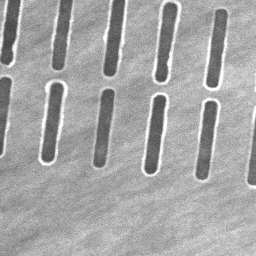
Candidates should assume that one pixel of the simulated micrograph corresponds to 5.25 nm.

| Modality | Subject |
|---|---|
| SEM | holes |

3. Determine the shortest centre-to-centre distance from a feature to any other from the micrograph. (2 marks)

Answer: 0.272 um